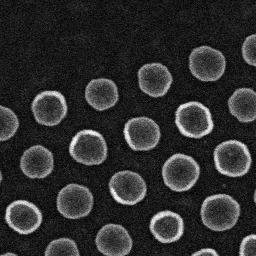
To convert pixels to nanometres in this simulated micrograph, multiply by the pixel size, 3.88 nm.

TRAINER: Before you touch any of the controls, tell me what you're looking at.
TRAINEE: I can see a regular array of raised bodies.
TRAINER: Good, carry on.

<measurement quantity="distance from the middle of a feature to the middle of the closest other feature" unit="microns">0.209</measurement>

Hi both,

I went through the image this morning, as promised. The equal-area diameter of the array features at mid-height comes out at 35.2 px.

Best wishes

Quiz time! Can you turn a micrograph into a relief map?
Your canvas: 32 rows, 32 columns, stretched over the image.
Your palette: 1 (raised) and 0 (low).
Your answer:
00000000000000000000000000000000
00000000000000000000000000000000
00000000000000000000000000000000
00000000000000000000000000000000
00000000000000000000000000000001
00000000000000000000000000000011
00000000000000000000000011100011
00000000000000000000000011110001
00000000000000000011100011110000
00000000000000000111100011110000
00000000000111000111100000000000
00000010000111100011100000000111
00001111000111100000000000000111
10001111000011000000001111000111
11001111000000000000001111000111
11000110000000001110001111100000
11000000001100011111000111000000
00000000011110001111000000000000
00001100011110000110000000011110
00011110011110000000001000011110
00011110000100000000011110011110
00011100000000011000111110001110
00000000000000111100111110000000
00000000111000111100011100000000
00000001111000111100000000011000
01110001111000001000000001111100
01111000111000000000100001111100
01111000000000000001111001111100
01111000000001100001111000111000
00000000000011110001111000000001
00000011100011110000000000000011
00000011110001110000000001100011